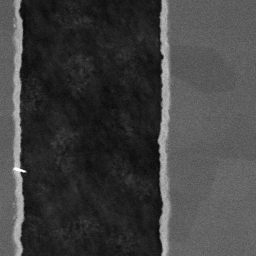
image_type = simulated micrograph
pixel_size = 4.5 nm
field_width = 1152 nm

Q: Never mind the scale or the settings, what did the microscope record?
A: one or a few lines or trenches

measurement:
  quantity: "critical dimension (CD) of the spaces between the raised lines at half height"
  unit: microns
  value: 0.655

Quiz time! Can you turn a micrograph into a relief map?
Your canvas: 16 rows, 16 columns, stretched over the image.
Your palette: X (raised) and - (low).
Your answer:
X---------XXXXXX
X---------XXXXXX
X---------XXXXXX
X---------XXXXXX
X---------XXXXXX
X---------XXXXXX
X---------XXXXXX
X---------XXXXXX
X---------XXXXXX
X---------XXXXXX
X---------XXXXXX
X---------XXXXXX
X---------XXXXXX
X---------XXXXXX
X---------XXXXXX
X---------XXXXXX